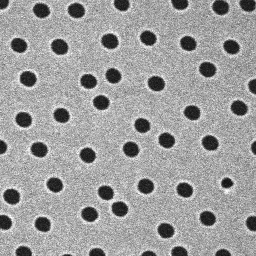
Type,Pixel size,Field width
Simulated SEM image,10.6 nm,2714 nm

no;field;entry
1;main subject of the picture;a regular array of holes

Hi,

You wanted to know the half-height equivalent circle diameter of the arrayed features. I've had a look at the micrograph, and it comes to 176 nm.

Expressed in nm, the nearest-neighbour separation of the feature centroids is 368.